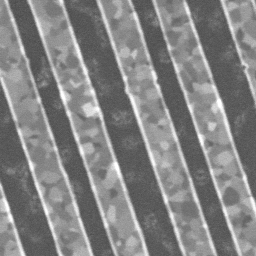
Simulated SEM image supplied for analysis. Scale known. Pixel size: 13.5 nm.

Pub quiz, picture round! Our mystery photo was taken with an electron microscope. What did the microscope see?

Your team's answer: parallel lines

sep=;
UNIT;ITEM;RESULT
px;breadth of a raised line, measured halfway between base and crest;28.9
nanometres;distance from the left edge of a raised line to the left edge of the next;775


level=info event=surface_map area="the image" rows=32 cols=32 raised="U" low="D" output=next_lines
UDDDUUUUDDDDDUUUDDDUUUUDDDDDUUUU
UDDDUUUUDDDDDUUUUDDDUUUDDDDDUUUU
UUDDDUUUDDDDDUUUUDDDUUUUDDDDDUUU
UUDDDUUUUDDDDDUUUDDDUUUUDDDDDUUU
UUDDDUUUUDDDDDUUUUDDDUUUUDDDDUUU
UUUDDDUUUDDDDDUUUUDDDUUUUDDDDDUU
UUUDDDUUUUDDDDUUUUDDDUUUUDDDDDUU
UUUDDDUUUUDDDDDUUUUDDDUUUUDDDDUU
UUUUDDDUUUDDDDDUUUUDDDUUUUDDDDDU
UUUUDDDUUUUDDDDDUUUDDDUUUUDDDDDU
UUUUDDDUUUUDDDDDUUUDDDDUUUUDDDDU
DUUUUDDDUUUUDDDDUUUUDDDUUUUDDDDD
DUUUUDDDUUUUDDDDDUUUDDDUUUUDDDDD
DUUUUDDDUUUUDDDDDUUUUDDDUUUUDDDD
DDUUUUDDDUUUUDDDDUUUUDDDUUUUDDDD
DDUUUUDDDUUUUDDDDDUUUDDDUUUUDDDD
DDUUUUDDDUUUUDDDDDUUUUDDDUUUUDDD
DDDUUUUDDDUUUDDDDDUUUUDDDUUUUDDD
DDDUUUUDDDUUUUDDDDDUUUDDDUUUUDDD
DDDUUUUDDDUUUUDDDDDUUUUDDDUUUUDD
DDDDUUUDDDDUUUDDDDDUUUUDDDUUUUDD
DDDDUUUUDDDUUUUDDDDUUUUDDDUUUUDD
DDDDUUUUDDDUUUUDDDDDUUUUDDDUUUUD
DDDDDUUUUDDDUUUDDDDDUUUUDDDUUUUD
DDDDDUUUUDDDUUUUDDDDDUUUDDDUUUUD
UDDDDUUUUDDDUUUUDDDDDUUUUDDDUUUU
UDDDDDUUUUDDDUUUDDDDDUUUUDDDUUUU
UDDDDDUUUUDDDUUUUDDDDDUUUDDDUUUU
UUDDDDUUUUDDDUUUUDDDDDUUUUDDDUUU
UUDDDDDUUUUDDDUUUUDDDDUUUUDDDUUU
UUDDDDDUUUUDDDUUUUDDDDDUUUDDDDUU
UUUDDDDUUUUDDDUUUUDDDDDUUUUDDDUU